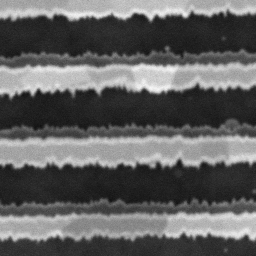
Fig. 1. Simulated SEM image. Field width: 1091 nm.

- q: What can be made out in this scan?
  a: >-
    lines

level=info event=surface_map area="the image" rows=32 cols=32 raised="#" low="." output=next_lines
################################
################################
................................
................................
................................
................................
................................
................................
#.##############################
################################
################################
###..##............#............
................................
................................
................................
................................
................................
################################
################################
################################
########.########.####.##.#.#...
................................
................................
................................
................................
................................
................................
################################
################################
##################.###..#..###.#
................................
................................